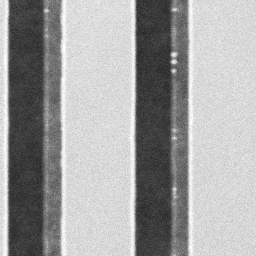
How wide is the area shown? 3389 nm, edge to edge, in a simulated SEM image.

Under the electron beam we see lines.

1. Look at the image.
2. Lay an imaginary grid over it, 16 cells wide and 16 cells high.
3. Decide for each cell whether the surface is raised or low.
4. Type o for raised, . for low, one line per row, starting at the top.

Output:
o..ooooo...ooooo
o..ooooo...ooooo
...ooooo...ooooo
...ooooo...ooooo
...ooooo...ooooo
...ooooo...ooooo
...ooooo...ooooo
o..ooooo...ooooo
o..ooooo...ooooo
...ooooo...ooooo
...ooooo...ooooo
...ooooo...ooooo
...ooooo...ooooo
...ooooo...ooooo
...ooooo...ooooo
...ooooo...ooooo